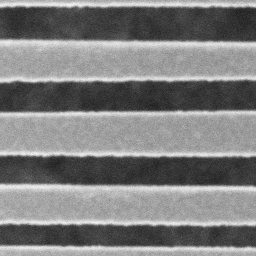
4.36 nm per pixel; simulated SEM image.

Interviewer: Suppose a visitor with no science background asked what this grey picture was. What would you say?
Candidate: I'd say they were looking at lines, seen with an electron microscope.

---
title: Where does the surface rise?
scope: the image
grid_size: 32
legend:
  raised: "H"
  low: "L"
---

HHHHHHHHHHHHHHHHHHHHHHHHHHHHHHHH
LLLLLLLLLLLLLLLLLLLLLLLLLLLLLLLL
LLLLLLLLLLLLLLLLLLLLLLLLLLLLLLLL
LLLLLLLLLLLLLLLLLLLLLLLLLLLLLLLL
LLLLLLLLLLLLLLLLLLLLLLLLLLLLLLLL
HHHHHHHHHHHHHHHLHHHHHHHHHHHHHHHH
HHHHHHHHHHHHHHHHHHHHHHHHHHHHHHHH
HHHHHHHHHHHHHHHHHHHHHHHHHHHHHHHH
HHHHHHHHHHHHHHHHHHHHHHHHHHHHHHHH
HHHHHHHHHHHHHHHHHHHHHHHHHHHHHHHH
LLLLLLLLLLLLLLLLLLLLLLLLLLLLLLLL
LLLLLLLLLLLLLLLLLLLLLLLLLLLLLLLL
LLLLLLLLLLLLLLLLLLLLLLLLLLLLLLLL
LLLLLLLLLLLLLLLLLLLLLLLLLLLLLLLL
HHHHHHHHHHHHHHHHHHHHHHHHHHHHHHHH
HHHHHHHHHHHHHHHHHHHHHHHHHHHHHHHH
HHHHHHHHHHHHHHHHHHHHHHHHHHHHHHHH
HHHHHHHHHHHHHHHHHHHHHHHHHHHHHHHH
HHHHHHHHHHHHHHHHHHHHHHHHHHHHHHHH
LLLLLLLLLLLLHLHHHHHHHHHHHHHHHHHH
LLLLLLLLLLLLLLLLLLLLLLLLLLLLLLLL
LLLLLLLLLLLLLLLLLLLLLLLLLLLLLLLL
LLLLLLLLLLLLLLLLLLLLLLLLLLLLLLLL
HHHHHHHHHHLLLLLLLLLLHHHHHHHHHHHH
HHHHHHHHHHHHHHHHHHHHHHHHHHHHHHHH
HHHHHHHHHHHHHHHHHHHHHHHHHHHHHHHH
HHHHHHHHHHHHHHHHHHHHHHHHHHHHHHHH
HHHHHHHHHHHHHHHHHHHHHHHHHHHHHHHH
LLLLLLLLLLLLLLLLLLLLLLLLLLLLLLLL
LLLLLLLLLLLLLLLLLLLLLLLLLLLLLLLL
LLLLLLLLLLLLLLLLLLLLLLLLLLLLLLLL
HHHHHHHHHHHHHHHHHHHHHHHHHHHHHHHH